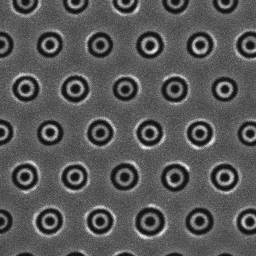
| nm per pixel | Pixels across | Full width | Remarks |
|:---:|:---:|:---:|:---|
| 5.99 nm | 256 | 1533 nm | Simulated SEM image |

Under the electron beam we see a regular array of ring-shaped grooves with a dot in the middle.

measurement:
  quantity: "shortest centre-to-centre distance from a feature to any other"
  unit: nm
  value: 298